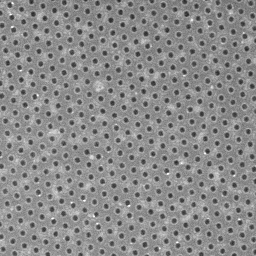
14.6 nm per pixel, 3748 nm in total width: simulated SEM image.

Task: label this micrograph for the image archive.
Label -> a regular array of holes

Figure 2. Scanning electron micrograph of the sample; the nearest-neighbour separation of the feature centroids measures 180 nanometres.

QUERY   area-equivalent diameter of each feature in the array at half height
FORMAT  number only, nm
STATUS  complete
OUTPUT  90.5